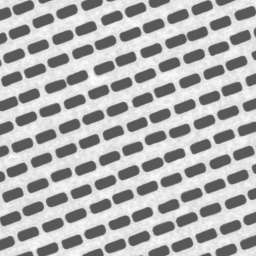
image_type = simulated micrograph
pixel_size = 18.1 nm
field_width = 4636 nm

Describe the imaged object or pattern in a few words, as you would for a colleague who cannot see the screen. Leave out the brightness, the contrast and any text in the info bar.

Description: a regular array of holes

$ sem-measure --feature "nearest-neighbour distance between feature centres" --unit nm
435